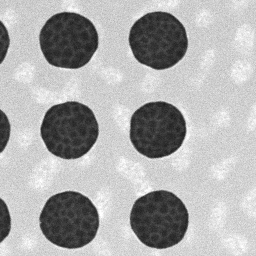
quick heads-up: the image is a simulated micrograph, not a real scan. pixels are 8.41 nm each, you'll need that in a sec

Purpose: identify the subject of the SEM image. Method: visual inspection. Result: holes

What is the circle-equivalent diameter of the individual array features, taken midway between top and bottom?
0.491 µm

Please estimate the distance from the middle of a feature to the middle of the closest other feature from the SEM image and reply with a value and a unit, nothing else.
753 nm